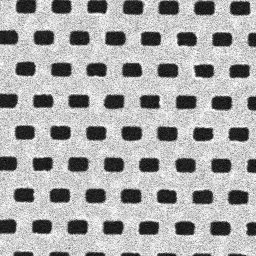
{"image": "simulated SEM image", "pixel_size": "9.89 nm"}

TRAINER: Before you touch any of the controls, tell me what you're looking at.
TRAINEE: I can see a regular array of holes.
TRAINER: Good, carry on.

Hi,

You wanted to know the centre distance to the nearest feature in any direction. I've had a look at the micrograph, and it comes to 351 nm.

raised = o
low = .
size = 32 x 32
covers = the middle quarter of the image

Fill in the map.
..oooo.....oooo....ooooo.....ooo
..ooo......ooo......ooo......ooo
..oooo.....ooo......ooo......ooo
oooooooooooooooooooooooo....oooo
oooooooooooooooooooooooooooooooo
oooooooooooooooooooooooooooooooo
oooooooooooooooooooooooooooooooo
oo....oooooooooooooooooooooooooo
o.....oooo.....oooo.....oooo....
o.....oooo.....oooo.....oooo....
o.....oooo.....oooo.....oooo....
oooooooooooooooooooooooooooooooo
oooooooooooooooooooooooooooooooo
oooooooooooooooooooooooooooooooo
oooooooooooooooooooooooooooooooo
.oooooo..oooooo....ooooo..oooooo
..ooo......ooo.....oooo.....oooo
..ooo......ooo......ooo......ooo
..oooo....oooo.....oooo.....oooo
oooooooooooooooooooooooooooooooo
oooooooooooooooooooooooooooooooo
oooooooooooooooooooooooooooooooo
oooooooooooooooooooooooooooooooo
o.....oooo.....oooo....oooooo...
o.....oooo.....oooo.....oooo....
o.....oooo.....ooo......oooo....
o.....oooo.....oooo.....oooo....
oooooooooooooooooooooooooooooooo
oooooooooooooooooooooooooooooooo
oooooooooooooooooooooooooooooooo
oooooooooooooooooooooooooooooooo
.ooooo....ooooo....ooooo...ooooo